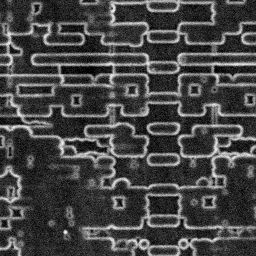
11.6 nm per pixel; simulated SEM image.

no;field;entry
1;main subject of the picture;wiring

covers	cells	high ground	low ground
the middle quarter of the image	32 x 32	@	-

---------------------@@@@@@@@---
---------------------@@@@@@@@---
--------------------------------
------------@@@@@@@@@--------@@@
------------@@@@@@@@@--------@@@
@@@@@@@@@@@@@@@@--@@@--------@@@
@@@@@@@@@@@@@@@@--@@@--------@@@
@@@@@@@@@@@@@@@@--@@@@@@@@@@@@@@
@@--@@@@@@@@@@@@@@@@@@@@@@@@@@@@
@@--@@@@@@@@@@@@@@@@@@@@@@@@@@@@
@@@@@@@@@@@---@@@@@@@--------@@@
@@@@@@@@@@@---@@@@@-@--------@@@
@@@@@@@@@@@----@@@@@@--------@@@
--------------------------------
--------------------------------
------@@@@@@@@@@@----@@@@@@@@---
-----@@@@@@@@@@@@@---@@@@@@@@---
-----@@@@@@@@@@@@-----@@@@@@----
------------@@@@@@@@@--------@@@
------------@@@@@@@@@--------@@@
------------@@@@@@@@@--------@@@
------------@@@@@@@@@--------@@@
------------@@@@@@@@---------@@@
@@@@@@@-@@@@---------@@@@@@@@---
@@@@@@@@@@@@@--------@@@@@@@@---
@@@@@@@@@@@@--------------------
@@@@@@@@@@@@@-------------------
@@@@@@@@@@@@@-------------------
@@@@@@@@@@----------------------
@@@@@@@@@@---@@@----------------
@@@@@@@@@@--@@@@@----@@@@@@@----
@@@@@@@@@@@@@@@@@@@@@@@@@@@@@@@@